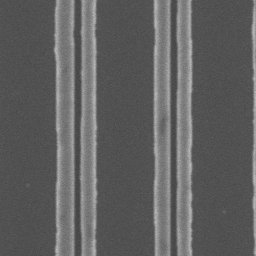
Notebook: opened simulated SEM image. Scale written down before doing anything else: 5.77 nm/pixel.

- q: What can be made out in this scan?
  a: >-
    lines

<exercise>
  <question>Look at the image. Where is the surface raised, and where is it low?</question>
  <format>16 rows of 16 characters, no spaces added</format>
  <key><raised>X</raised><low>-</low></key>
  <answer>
---XXX----XX----
---XXX----XX----
---XXX----XX----
---XXX----XX----
----XX----XX----
----XX----XX----
----XX----XX----
----XX----XX----
----XX----XX----
----XX----XX----
----XX----XX----
----XX----XX----
----XX----XX----
----XX----XX----
----XX----XX----
---XXX----XX----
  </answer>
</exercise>